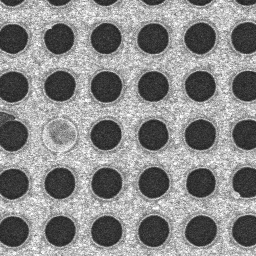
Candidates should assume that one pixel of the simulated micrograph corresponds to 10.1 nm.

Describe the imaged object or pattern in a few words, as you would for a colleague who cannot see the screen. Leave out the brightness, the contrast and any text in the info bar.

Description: a regular array of holes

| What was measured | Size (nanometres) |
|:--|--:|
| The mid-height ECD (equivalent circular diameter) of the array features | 313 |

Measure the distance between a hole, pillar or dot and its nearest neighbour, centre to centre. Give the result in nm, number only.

475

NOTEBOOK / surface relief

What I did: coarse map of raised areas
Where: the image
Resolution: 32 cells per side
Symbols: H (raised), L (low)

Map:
HLHHHHLLHHHHLLHHHHLLHHHHLLHHHHLL
HHHHHHHHHHHHHHHHHHHHHHHHHHHHHHHH
HHHHHHHHHHHHHHHHHHHHHHHHHHHHHHHH
LLLHHHLLLHHHLLLHHHLLLHHHLLLHHLLL
LLLHHHLLLHHLLLLHHLLLLHHLLLLHHLLL
LLLHHHLLLHHLLLLHHLLLLHHLLLLHHLLL
HLHHHHLLHHHHLLHHHHLLHHHHLLHHHHLL
HHHHHHHHHHHHHHHHHHHHHHHHHHHHHHHH
HHHHHHHHHHHHHHHHHHHHHHHHHHHHHHHH
LLLHHHLLLHHHLLLHHHLLLHHHLLHHHHLL
LLLHHHLLLHHLLLLHHLLLLHHLLLLHHLLL
LLLHHHLLLHHHLLLHHLLLLHHLLLLHHLLL
LLHHHHHLHHHHLLHHHHLLHHHHLLHHHHLL
HHHHHHHHHHHHHHHHHHHHHHHHHHHHHHHH
LLHHHHHHHHHHHHHHHHHHHHHHHHHHHHHH
LLLHHHHHHHHHLLLHHHLLHHHHLLHHHHLL
LLLHHHHHHHHLLLLHHLLLLHHLLLLHHLLL
LLLHHHHHHHHLLLLHHLLLLHHLLLLHHLLL
LLLHHHHHHHHHLLHHHHLLHHHHLLHHHHLL
HHHHHHHHHHHHHHHHHHHHHHHHHHHHHHHH
HHHHHHHHHHHHHHHHHHHHHHHHHHHHHHHH
LLLHHHLLLHHHLLLHHHLLLHHHLLHHHHLL
LLLLHHLLLHHHLLLHHLLLLHHLLLLHHLLL
LLLLHHLLLHHLLLLHHLLLLHHLLLLHHLLL
LLLHHHLLLHHHLLHHHHLLHHHHLLHHHHLL
HHHHHHHHHHHHHHHHHHHHHHHHHHHHHHHH
HHHHHHHHHHHHHHHHHHHHHHHHHHHHHHHH
HLLHHHLLLHHHLLLHHHLLLHHHLLLHHHLL
LLLLHHLLLHHLLLLHHLLLLHHLLLLHHLLL
LLLHHHLLLHHLLLLHHLLLLHHLLLLHHLLL
HLLHHHHLHHHHLLHHHHLLHHHHLLHHHHLL
HHHHHHHHHHHHHHHHHHHHHHHHHHHHHHHH